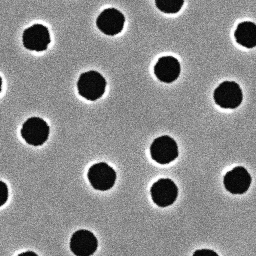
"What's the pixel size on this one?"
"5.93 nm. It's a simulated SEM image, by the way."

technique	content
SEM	a regular array of holes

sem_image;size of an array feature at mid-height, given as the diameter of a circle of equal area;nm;172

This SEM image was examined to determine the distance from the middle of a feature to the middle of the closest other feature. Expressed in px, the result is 66.4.